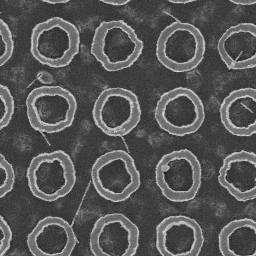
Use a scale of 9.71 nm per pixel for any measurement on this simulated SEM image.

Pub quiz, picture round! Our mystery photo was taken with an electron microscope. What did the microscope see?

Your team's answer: a regular array of ring-shaped raised bodies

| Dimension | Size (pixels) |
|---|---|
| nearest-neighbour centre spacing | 62.2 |